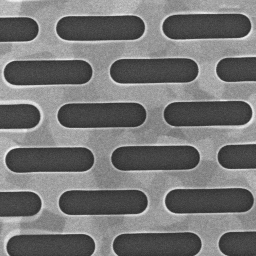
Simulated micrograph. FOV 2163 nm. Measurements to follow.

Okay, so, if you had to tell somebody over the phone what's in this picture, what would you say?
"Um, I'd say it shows groups of lines, slits or small figures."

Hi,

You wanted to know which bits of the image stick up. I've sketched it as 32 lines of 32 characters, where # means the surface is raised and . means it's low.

################################
################################
....###...........###..........#
.....##...........##...........#
.....##...........###..........#
################################
################################
###.......#####.........####....
#..........###...........##.....
...........###...........##.....
#.........#####..###############
################################
################################
.....###..........###..........#
.....##...........##............
.....###..........###..........#
################################
################################
##.........####.........####....
#...........##...........##.....
#...........##...........##.....
##........######################
################################
###########################...##
.....###..........###...........
.....##............##...........
.....###..........###.........##
################################
################################
#..........####..........###....
#...........##...........##.....
#...........##...........###....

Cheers